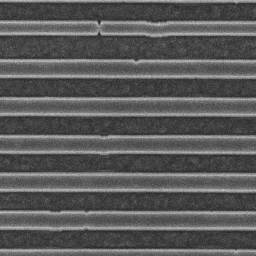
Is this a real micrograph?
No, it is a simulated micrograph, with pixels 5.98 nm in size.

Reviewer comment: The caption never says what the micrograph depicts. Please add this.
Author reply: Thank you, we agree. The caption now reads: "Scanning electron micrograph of parallel lines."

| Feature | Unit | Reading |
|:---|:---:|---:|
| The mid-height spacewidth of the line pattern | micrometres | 0.128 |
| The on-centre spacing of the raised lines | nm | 230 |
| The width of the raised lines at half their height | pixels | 17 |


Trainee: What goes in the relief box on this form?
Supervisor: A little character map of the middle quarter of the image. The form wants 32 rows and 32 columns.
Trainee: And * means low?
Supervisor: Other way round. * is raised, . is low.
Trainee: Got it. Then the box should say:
********************************
********************************
********************************
................................
................................
................................
................................
................................
................................
********************************
********************************
********************************
********************************
................................
................................
................................
................................
................................
********************************
********************************
********************************
********************************
................................
................................
................................
................................
................................
................................
********************************
********************************
********************************
********.**...........**********